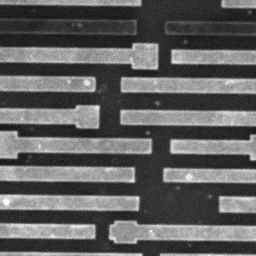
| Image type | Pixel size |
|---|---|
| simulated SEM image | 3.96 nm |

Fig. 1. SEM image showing wiring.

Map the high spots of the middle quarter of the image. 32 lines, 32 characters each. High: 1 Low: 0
00000000000000000111111000000000
00000000000000000000000000000000
00000000000000000000000000000000
11111111000000111111000000000000
11111111000000111111111111111111
11111111000000111111111111111111
11111111000000111111111111111111
00000000000000000000000000000000
00000000000000000000000000000000
00000000000000000000000000000000
00000000000000000000000000000000
11111111100000000000000000000000
11111111000000111111111111111111
11111111000000111111111111111111
11111111000000111111111111111111
00011111000000000000000000000000
00000000000000000000000000000000
00000000000000000000000000000000
00000000000000000000000000000000
11111111111111111111110000011111
11111111111111111111110000011111
11111111111111111111110000011111
00000000000000000000000000000000
00000000000000000000000000000000
00000000000000000000000000000000
00000000000000000000000000000000
11111111111111111100000001111111
11111111111111111100000001111111
11111111111111111100000001111111
00000000000000000000000000000000
00000000000000000000000000000000
00000000000000000000000000000000